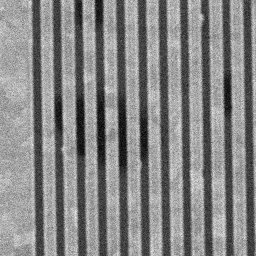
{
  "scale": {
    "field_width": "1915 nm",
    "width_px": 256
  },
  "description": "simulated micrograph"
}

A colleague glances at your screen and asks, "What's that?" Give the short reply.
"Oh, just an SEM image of parallel lines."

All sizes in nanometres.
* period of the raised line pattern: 158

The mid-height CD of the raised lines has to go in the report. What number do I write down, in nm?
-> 73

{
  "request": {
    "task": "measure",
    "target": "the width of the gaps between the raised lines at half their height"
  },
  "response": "87.9 nm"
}